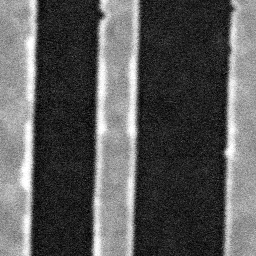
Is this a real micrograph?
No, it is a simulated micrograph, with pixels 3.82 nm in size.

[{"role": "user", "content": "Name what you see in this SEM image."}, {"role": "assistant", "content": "one or a few lines or trenches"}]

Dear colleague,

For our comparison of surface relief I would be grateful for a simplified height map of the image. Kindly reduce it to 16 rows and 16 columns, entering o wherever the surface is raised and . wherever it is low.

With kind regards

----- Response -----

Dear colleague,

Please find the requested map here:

oo....ooo......o
oo....ooo......o
oo....ooo.....oo
oo....oo.......o
oo....oo......oo
oo....oo......oo
oo....oo......oo
oo....oo......oo
oo....oo......oo
oo....oo......oo
oo....oo......oo
oo....oo......oo
oo....oo......oo
oo....oo......oo
oo....oo......oo
oo....oo......oo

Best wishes